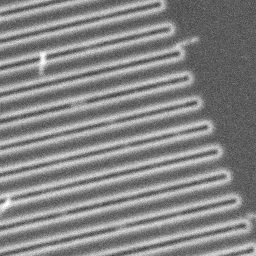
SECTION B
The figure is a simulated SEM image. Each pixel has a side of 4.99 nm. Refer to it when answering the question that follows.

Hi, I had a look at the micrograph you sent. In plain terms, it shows parallel lines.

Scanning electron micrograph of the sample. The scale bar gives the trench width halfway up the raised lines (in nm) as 33.4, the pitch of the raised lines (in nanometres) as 130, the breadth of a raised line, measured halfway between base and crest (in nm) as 97.3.